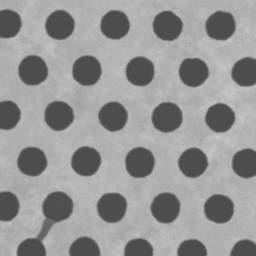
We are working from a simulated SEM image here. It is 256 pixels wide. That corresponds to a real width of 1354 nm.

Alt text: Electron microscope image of a regular array of holes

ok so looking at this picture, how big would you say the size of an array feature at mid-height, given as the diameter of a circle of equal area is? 154 nm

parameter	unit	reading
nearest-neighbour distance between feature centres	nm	277